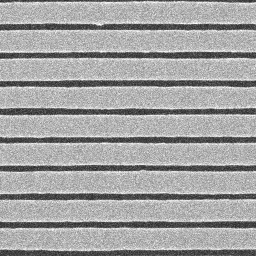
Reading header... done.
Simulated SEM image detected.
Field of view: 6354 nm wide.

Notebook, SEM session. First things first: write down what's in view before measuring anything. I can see parallel lines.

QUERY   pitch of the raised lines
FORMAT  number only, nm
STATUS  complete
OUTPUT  701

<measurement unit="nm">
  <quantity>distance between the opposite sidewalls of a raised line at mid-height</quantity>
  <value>531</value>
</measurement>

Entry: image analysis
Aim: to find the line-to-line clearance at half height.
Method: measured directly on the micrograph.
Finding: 6.88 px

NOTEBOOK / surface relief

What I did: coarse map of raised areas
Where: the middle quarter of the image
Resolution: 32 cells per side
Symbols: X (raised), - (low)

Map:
XXXXXXXXXXXXXXXXXXXXXXXXXXXXXXXX
XXXXXXXXXXXXXXXXXXXXXXXXXXXXXXXX
XXXXXXXXXXXXXXXXXXXXXXXXXXXXXXXX
XXXXXXXXXXXXXXXXXXXXXXXXXXXXXXXX
--------------------------------
--------------------------------
XXXXXXXXXXXXXXXXXXXXXXXXXXXXXXXX
XXXXXXXXXXXXXXXXXXXXXXXXXXXXXXXX
XXXXXXXXXXXXXXXXXXXXXXXXXXXXXXXX
XXXXXXXXXXXXXXXXXXXXXXXXXXXXXXXX
XXXXXXXXXXXXXXXXXXXXXXXXXXXXXXXX
--------------------------------
--------------------------------
XXXXXXXXXXXXXXXXXXXXXXXXXXXXXXXX
XXXXXXXXXXXXXXXXXXXXXXXXXXXXXXXX
XXXXXXXXXXXXXXXXXXXXXXXXXXXXXXXX
XXXXXXXXXXXXXXXXXXXXXXXXXXXXXXXX
XXXXXXXXXXXXXXXXXXXXXXXXXXXXXXXX
--------------------------------
--------------------------------
XXXXXXXXXXXXXXXXXXXXXXXXXXXXXXXX
XXXXXXXXXXXXXXXXXXXXXXXXXXXXXXXX
XXXXXXXXXXXXXXXXXXXXXXXXXXXXXXXX
XXXXXXXXXXXXXXXXXXXXXXXXXXXXXXXX
XXXXXXXXXXXXXXXXXXXXXXXXXXXXXXXX
--------------------------------
--------------------------------
XXXXXXXXXXXXXXXXXXXXXXXXXXXXXXXX
XXXXXXXXXXXXXXXXXXXXXXXXXXXXXXXX
XXXXXXXXXXXXXXXXXXXXXXXXXXXXXXXX
XXXXXXXXXXXXXXXXXXXXXXXXXXXXXXXX
XXXXXXXXXXXXXXXXXXXXXXXXXXXXXXXX